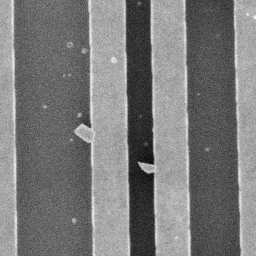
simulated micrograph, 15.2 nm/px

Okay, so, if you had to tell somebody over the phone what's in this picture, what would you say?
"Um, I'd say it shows lines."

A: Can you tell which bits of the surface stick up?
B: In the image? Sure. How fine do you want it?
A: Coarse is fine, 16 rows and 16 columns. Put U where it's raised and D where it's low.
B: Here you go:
UDDDDDUUDUUUDDDU
UDDDDDUUDUUUDDDU
UDDDDDUUDUUUDDDU
UDDDDDUUDDUUDDDU
UDDDDDUUDDUUDDDU
UDDDDDUUDDUUDDDU
UDDDDDUUDDUUDDDU
UDDDDDUUDDUUDDDU
UDDDDUUUDDUUDDDU
UDDDDDUUDDUUDDDU
UDDDDDUUDUUUDDDU
UDDDDDUUDDUUDDDU
UDDDDDUUDDUUDDDU
UDDDDDUUDDUUDDDU
UDDDDDUUDDUUDDDU
UDDDDDUUDDUUDDDU